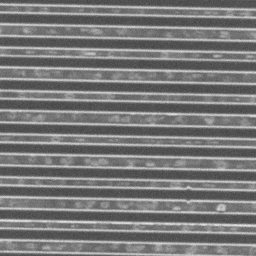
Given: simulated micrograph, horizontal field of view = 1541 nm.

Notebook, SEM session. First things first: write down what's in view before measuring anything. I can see parallel lines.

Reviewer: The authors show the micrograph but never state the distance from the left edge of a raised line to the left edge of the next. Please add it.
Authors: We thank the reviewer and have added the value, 130 nanometers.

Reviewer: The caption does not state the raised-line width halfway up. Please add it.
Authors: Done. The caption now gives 73.7 nanometers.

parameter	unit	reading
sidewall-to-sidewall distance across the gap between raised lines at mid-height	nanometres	45.9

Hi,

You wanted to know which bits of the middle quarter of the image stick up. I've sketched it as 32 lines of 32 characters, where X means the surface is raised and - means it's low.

XXXXXXXXXXXXXXXXXXXXXXXXXXXXXXXX
-----------------XXXXXXXXXXXXXXX
--------------------------------
--------------------------------
XXXXXXXXXXXXXXX-----------------
XXXXXXXXXXXXXXXXXXXXXXXXXXXXXXXX
XXXXXXXXXXXXXXXXXXXXXXXXXXXXXXXX
------------------------XXXXXXXX
--------------------------------
XXXXXXXXXXXXXXXXXX--------------
XXXXXXXXXXXXXXXXXXXXXXXXXXXXXXXX
XXXXXXXXXXXXXXXXXXXXXXXXXXXXXXXX
---------------------------XXXXX
--------------------------------
--------------------------------
XXXXXXXXXXXXXXXXXXXXXXXXX-------
XXXXXXXXXXXXXXXXXXXXXXXXXXXXXXXX
XXXXXXXXXXXXXXXXXXXXXXXXXXXXXXXX
--------------------------------
--------------------------------
XXXXXXXXXXXXXXXXXXXXXXXXXXXXX---
XXXXXXXXXXXXXXXXXXXXXXXXXXXXXXXX
XXXXXXXXXXXXXXXXXXXXXXXXXXXXXXXX
--------------------------------
--------------------------------
--------------------------------
XXXXXXXXXXXXXXXXXXXXXXXXXXXXXXXX
XXXXXXXXXXXXXXXXXXXXXXXXXXXXXXXX
XXXXXXXXXXXXXXXXXXXXXXXXXXXXXXXX
--------------------------------
--------------------------------
XXXXXXXXXXXXXXXXXXXXXXXXXXXXXXXX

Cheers